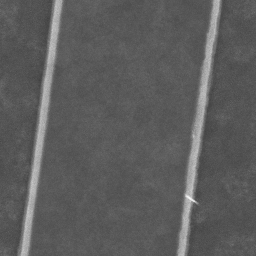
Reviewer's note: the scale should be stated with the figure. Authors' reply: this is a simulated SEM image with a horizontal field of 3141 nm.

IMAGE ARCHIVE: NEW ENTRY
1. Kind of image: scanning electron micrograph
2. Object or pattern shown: one or a few lines or trenches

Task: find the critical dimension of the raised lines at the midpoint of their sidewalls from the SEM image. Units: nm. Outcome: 1920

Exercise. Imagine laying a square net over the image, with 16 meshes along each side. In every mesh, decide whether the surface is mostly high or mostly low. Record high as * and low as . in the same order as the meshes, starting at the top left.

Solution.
....**********..
...**********...
...**********...
...**********...
...**********...
...**********...
...**********...
...**********...
...*********....
..**********....
..**********....
..**********....
..**********....
..**********....
..**********....
..*********.....